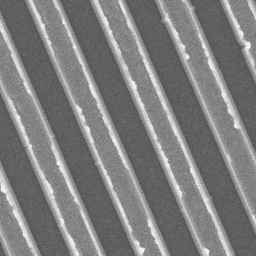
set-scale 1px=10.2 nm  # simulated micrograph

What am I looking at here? parallel lines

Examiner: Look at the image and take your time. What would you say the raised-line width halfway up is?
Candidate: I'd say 280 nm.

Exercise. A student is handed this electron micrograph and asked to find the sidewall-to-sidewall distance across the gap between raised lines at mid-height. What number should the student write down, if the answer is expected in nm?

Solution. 330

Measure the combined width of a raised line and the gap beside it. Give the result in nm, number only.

608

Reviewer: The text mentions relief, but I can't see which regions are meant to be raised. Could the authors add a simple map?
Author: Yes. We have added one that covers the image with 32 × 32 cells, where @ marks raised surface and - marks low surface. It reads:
----@@@-----@@@-----@@@@----@@@@
----@@@@----@@@@----@@@@----@@@@
----@@@@-----@@@-----@@@-----@@@
@----@@@@----@@@@----@@@@----@@@
@----@@@@----@@@@-----@@@-----@@
@-----@@@-----@@@@----@@@@----@@
@@----@@@@----@@@@----@@@@-----@
@@-----@@@-----@@@@----@@@@----@
@@@----@@@@----@@@@----@@@@-----
@@@----@@@@-----@@@-----@@@@----
@@@@----@@@@----@@@@----@@@@----
@@@@----@@@@----@@@@-----@@@----
-@@@@----@@@@----@@@@----@@@@---
-@@@@----@@@@----@@@@-----@@@---
--@@@-----@@@-----@@@@----@@@@--
--@@@@----@@@@----@@@@----@@@@--
--@@@@-----@@@-----@@@-----@@@@-
---@@@@----@@@@----@@@@----@@@@-
---@@@@----@@@@-----@@@-----@@@-
----@@@@----@@@@----@@@@----@@@@
----@@@@----@@@@----@@@@-----@@@
-----@@@-----@@@-----@@@@----@@@
@----@@@@----@@@@----@@@@----@@@
@-----@@@-----@@@-----@@@-----@@
@@----@@@@----@@@@----@@@@----@@
@@----@@@@-----@@@-----@@@-----@
@@-----@@@@----@@@@----@@@@----@
@@@----@@@@----@@@@----@@@@-----
@@@-----@@@-----@@@-----@@@@----
@@@@----@@@@----@@@@----@@@@----
@@@@-----@@@-----@@@-----@@@----
-@@@@----@@@@----@@@@----@@@@---